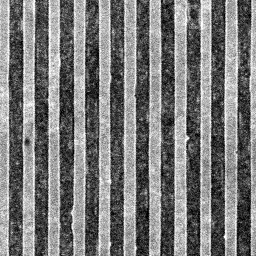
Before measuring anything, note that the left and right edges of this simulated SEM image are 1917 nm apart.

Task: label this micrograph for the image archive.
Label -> parallel lines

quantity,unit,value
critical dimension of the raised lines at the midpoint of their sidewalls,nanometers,82.4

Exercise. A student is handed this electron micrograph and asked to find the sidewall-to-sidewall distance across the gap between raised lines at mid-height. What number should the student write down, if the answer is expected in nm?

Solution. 110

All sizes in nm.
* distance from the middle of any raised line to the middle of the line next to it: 189